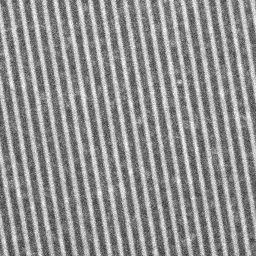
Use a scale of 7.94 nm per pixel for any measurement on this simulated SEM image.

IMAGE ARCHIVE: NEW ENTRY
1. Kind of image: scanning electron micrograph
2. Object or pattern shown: parallel lines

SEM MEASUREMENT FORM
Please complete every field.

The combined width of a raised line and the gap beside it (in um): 0.0906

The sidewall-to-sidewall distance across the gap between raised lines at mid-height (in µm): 0.0587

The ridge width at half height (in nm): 29.4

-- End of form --